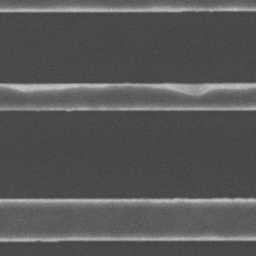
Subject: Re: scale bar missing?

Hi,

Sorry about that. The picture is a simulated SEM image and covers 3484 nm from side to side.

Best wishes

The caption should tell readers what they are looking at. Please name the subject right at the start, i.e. lines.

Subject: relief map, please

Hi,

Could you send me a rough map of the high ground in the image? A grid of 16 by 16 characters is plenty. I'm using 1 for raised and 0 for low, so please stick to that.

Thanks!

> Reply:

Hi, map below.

1111111111111111
0000000000000000
0000000000000000
0000000000000000
0000000000000000
1111111111111111
1111111111111111
0000000000000000
0000000000000000
0000000000000000
0000000000000000
0000000000000000
0000000000000000
1111111111111111
1111111111111111
0000000000000000